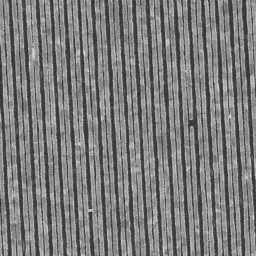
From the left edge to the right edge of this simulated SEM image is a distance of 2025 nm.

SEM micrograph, parallel lines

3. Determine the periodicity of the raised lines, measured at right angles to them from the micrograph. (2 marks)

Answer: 54.3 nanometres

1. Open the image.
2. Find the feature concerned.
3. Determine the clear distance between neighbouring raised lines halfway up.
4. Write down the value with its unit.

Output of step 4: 32.6 nm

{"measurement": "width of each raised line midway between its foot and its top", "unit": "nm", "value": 28.6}